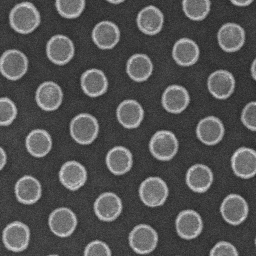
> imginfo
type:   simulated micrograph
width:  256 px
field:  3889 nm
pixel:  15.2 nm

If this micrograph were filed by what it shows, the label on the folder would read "a regular array of raised bodies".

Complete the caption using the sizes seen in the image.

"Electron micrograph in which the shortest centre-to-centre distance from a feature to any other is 0.712 um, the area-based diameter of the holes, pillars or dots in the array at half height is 0.394 microns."